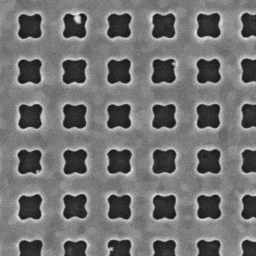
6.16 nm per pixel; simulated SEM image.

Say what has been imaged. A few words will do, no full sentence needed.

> a regular array of holes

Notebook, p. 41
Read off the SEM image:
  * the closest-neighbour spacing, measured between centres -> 274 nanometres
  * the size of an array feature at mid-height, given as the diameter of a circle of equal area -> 159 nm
